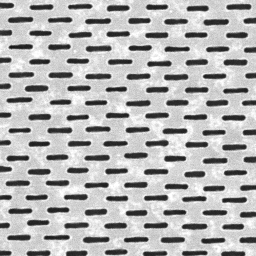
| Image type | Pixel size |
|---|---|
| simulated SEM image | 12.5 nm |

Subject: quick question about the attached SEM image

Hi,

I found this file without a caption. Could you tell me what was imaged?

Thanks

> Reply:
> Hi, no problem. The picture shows a regular array of holes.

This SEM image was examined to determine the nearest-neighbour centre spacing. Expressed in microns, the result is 0.282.